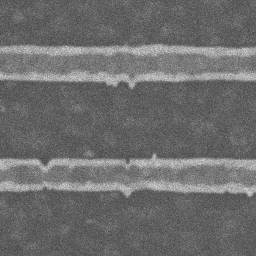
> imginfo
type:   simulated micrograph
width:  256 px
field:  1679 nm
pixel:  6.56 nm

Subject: one or a few lines or trenches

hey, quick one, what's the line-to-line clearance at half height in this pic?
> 0.546 µm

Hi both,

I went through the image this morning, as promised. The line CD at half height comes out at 0.185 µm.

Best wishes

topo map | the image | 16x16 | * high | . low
................
................
................
****************
****************
................
................
................
................
................
****************
****************
................
................
................
................